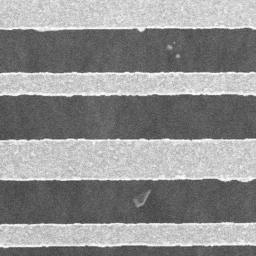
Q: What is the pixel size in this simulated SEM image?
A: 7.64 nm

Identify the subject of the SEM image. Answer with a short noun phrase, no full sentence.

lines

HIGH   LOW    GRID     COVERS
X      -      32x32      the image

XXXXXXXXXXXXXXXXXXXXXXXXXXXXXXXX
XXXXXXXXXXXXXXXXXXXXXXXXXXXXXXXX
XXXXXXXXXXXXXXXXXXXXXXXXXXXXXXXX
XX--X-XXXXX--XXXX---------------
--------------------------------
--------------------------------
--------------------------------
--------------------------------
--------------------------------
XXXXXXXXXXXXXXXXXXXXXXXXXXXXXXXX
XXXXXXXXXXXXXXXXXXXXXXXXXXXXXXXX
XXXXXXXXXXXXXXXXXXXXXXXXXXXXXXXX
--------------------------------
--------------------------------
--------------------------------
--------------------------------
--------------------------------
--------------------------------
XXXXXXXXXXXXXXXXXXXXXXXXXXXXXXXX
XXXXXXXXXXXXXXXXXXXXXXXXXXXXXXXX
XXXXXXXXXXXXXXXXXXXXXXXXXXXXXXXX
XXXXXXXXXXXXXXXXXXXXXXXXXXXXXXXX
--------------------------------
--------------------------------
--------------------------------
-----------------X--------------
--------------------------------
--------------------------------
XXXXXXXXXXXXXXXXXXXXXXXXXXXXXXXX
XXXXXXXXXXXXXXXXXXXXXXXXXXXXXXXX
XXXXXXXXXXX-XXX---XXXXXX--------
--------------------------------